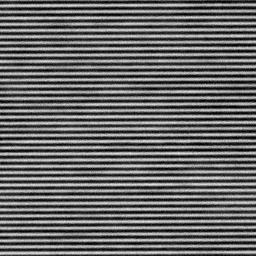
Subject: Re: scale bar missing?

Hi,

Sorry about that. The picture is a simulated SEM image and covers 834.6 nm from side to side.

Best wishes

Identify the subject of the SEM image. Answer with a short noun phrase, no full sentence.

parallel lines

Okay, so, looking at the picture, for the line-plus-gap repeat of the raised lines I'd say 20.2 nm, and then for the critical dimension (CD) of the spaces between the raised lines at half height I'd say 12.2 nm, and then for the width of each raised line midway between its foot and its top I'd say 1.87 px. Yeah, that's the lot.